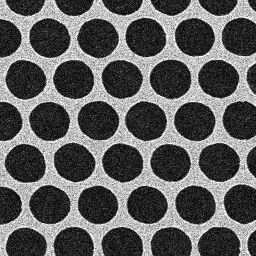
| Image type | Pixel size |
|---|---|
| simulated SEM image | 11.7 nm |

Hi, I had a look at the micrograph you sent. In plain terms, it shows a regular array of holes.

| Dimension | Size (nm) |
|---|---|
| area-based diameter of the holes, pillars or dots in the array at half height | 467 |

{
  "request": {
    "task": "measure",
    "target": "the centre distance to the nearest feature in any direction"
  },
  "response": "557 nanometres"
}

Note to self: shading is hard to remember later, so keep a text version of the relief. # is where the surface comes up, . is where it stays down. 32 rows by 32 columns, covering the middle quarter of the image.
......#####.......#####........#
.......###.........###.........#
.......##...........##..........
........#...........#...........
........##..........##..........
.......###.........###..........
.......###.........###.........#
......#####.......#####.......##
#...#########...#########....###
#######...#########..##########.
#####.......#####.......#####...
####.........###.........###....
.##..........###.........###....
.##...........#...........##....
.##...........#...........#.....
.###..........#...........##....
.###.........###.........###....
.####........####........####...
######......######......######..
####################.###########
.....#######.....#######.....###
......#####.......#####.......##
.......###.........###.........#
.......##...........##..........
........#...........#...........
........#...........##..........
.......###..........##.........#
.......###.........####........#
......######......######......##
##..##########..##########..####
#######...#########...#########.
#####......######.......#####...